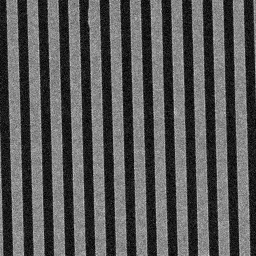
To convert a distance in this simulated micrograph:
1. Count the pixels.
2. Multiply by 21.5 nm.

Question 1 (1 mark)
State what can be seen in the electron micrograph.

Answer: parallel lines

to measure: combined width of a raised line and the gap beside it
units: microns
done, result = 0.442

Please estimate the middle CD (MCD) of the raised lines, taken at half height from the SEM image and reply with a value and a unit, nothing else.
10.5 pixels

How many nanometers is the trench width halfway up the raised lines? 217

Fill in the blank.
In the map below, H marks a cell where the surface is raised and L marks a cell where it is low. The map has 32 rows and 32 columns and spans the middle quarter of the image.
LLHHLLLHHLLLHHLLLHHLLLHHHLLHHHLL
LLHHLLLHHLLLHHLLLHHLLLHHHLLHHHLL
LLHHLLLHHLLLHHLLLHHHLLHHHLLHHHLL
LLHHLLLHHLLLHHLLLHHHLLHHHLLHHHLL
LLHHLLLHHLLLHHLLLHHHLLHHHLLHHHLL
LLHHLLLHHLLLHHLLLHHHLLHHHLLHHHLL
LLHHLLLHHLLLHHLLLHHHLLHHHLLLHHLL
LLHHLLLHHLLLHHHLLHHHLLLHHLLLHHLL
LLHHLLLHHLLLHHHLLHHHLLLHHLLLHHLL
LLHHLLLHHLLLHHHLLHHHLLLHHLLLHHLL
LLHHLLLHHLLLHHHLLHHHLLLHHLLLHHLL
LLHHLLLHHLLLHHHLLHHHLLLHHLLLHHLL
LLHHLLLHHLLLHHHLLHHHLLLHHLLLHHLL
LLHHLLLHHHLLHHHLLHHHLLLHHLLLHHLL
LLHHLLLHHHLLHHHLLHHHLLLHHLLLHHLL
LLHHLLLHHHLLHHHLLHHHLLLHHLLLHHLL
LLHHLLLHHHLLHHHLLHHHLLLHHLLLHHLL
LLHHLLLHHHLLHHHLLLHHLLLHHLLLHHLL
LLHHHLLHHHLLLHHLLLHHLLLHHLLLHHLL
LLHHHLLHHHLLLHHLLLHHLLLHHLLLHHLL
LLHHHLLHHHLLLHHLLLHHLLLHHLLLHHLL
LLHHHLLHHHLLLHHLLLHHLLLHHLLLHHLL
LLHHLLLHHHLLLHHLLLHHLLLHHLLLHHLL
LLHHHLLHHHLLLHHLLLHHLLLHHLLLHHLL
LLHHHLLHHHLLLHHLLLHHLLLHHLLLHHLL
LLHHHLLHHHLLLHHLLLHHLLLHHLLLHHLL
LLHHHLLHHHLLLHHLLLHHLLLHHLLLHHLL
LLHHHLLHHHLLLHHLLLHHLLLHHLLLHHLL
LLHHHLLLHHLLLHHLLLHHLLLHHLLLHHLL
LLHHHLLLHHLLLHHLLLHHLLLHHLLLHHHL
LLHHHLLLHHLLLHHLLLHHLLLHHLLLHHLL
LLHHHLLLHHLLLHHLLLHHLLLHHLLLHHLL